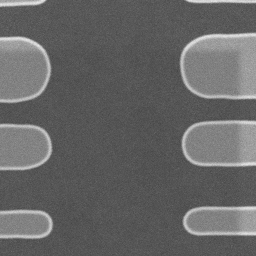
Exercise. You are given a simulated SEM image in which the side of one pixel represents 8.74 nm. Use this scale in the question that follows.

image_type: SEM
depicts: groups of lines, slits or small figures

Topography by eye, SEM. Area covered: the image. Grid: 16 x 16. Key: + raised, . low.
................
................
++..........++++
+++........+++++
+++........+++++
+++.........++++
................
................
+++.........++++
+++.........++++
++..............
................
................
+++.........++++
+++.........++++
................